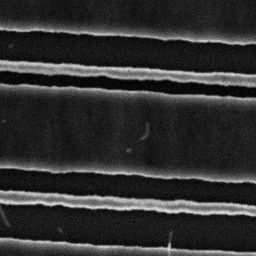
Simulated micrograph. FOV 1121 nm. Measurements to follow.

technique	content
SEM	lines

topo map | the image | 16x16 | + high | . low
++++++++++++++++
++++++++++++++++
............++++
................
................
+++++...........
++++++++++++++++
++++++++++++++++
++++++++++++++++
++++++++++++++++
.+++++++++++++++
................
................
................
................
+++++++++.......